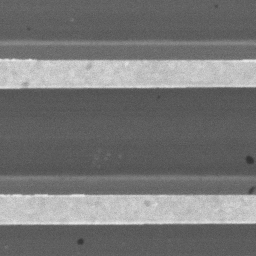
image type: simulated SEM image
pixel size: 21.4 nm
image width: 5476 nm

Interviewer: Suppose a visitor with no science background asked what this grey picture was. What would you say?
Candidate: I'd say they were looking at lines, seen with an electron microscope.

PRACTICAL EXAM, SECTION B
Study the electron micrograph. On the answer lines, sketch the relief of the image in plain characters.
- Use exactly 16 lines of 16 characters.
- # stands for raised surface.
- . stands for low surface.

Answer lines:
................
................
................
################
################
##..............
................
................
................
................
................
################
################
################
................
................